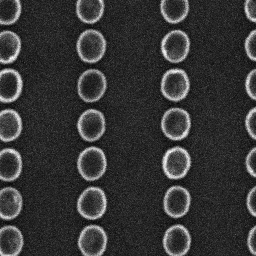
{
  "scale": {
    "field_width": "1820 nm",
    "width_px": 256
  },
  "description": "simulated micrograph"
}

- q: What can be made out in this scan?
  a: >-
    a regular array of raised bodies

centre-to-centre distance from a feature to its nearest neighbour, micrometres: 0.276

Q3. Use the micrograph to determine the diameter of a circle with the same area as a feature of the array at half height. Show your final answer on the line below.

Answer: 29.1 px